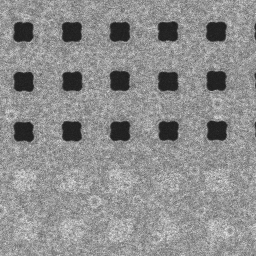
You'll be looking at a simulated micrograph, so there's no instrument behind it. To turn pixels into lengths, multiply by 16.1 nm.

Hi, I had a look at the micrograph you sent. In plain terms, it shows a regular array of holes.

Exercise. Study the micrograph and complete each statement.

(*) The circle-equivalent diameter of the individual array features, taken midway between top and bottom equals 21.5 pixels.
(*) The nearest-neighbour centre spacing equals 775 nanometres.